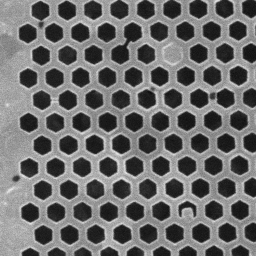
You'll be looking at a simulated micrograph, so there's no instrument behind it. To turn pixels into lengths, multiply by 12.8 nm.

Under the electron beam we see a regular array of holes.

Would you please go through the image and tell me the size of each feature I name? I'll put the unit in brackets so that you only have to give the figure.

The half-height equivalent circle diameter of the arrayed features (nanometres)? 251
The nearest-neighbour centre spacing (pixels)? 25.8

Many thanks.